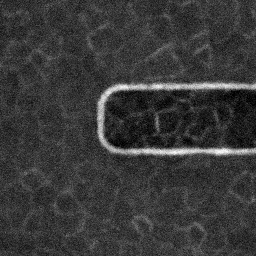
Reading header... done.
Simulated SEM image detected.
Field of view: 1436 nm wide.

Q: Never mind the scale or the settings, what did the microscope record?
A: one or a few lines or trenches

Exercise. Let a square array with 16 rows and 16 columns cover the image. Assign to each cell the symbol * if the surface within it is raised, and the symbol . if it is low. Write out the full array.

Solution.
................
................
................
................
................
.......*********
......**********
......**********
......**********
.........***.*..
................
................
................
................
................
................